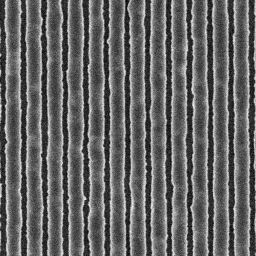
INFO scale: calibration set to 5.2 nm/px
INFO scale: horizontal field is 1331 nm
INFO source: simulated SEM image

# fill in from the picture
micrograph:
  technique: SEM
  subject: parallel lines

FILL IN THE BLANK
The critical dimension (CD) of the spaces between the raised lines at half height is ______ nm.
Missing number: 33.8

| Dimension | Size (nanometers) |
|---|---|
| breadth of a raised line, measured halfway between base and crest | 76.1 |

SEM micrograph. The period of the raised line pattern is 0.108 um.